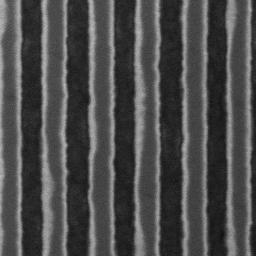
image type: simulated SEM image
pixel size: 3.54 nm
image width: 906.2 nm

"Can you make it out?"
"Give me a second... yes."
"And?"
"lines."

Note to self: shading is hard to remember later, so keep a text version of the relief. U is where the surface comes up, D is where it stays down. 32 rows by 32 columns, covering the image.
UUUDDUUUDDDUUUDDDUUUDDDUUUDDDUUD
UUUDDUUUDDDUUUDDDUUUDDDUUUDDUUUD
UUUDDUUUDDDUUUDDDUUUDDDUUUDDUUUD
UUUDDUUUDDDUUUDDDUUUDDDUUUDDUUUD
UUUDDUUUDDDUUUDDDUUUDDDUUUDDUUUD
UUUDDUUUDDDUUUDDDUUUDDDUUUDDUUUD
UUUDDUUUDDDUUUDDDUUUDDDUUUDDUUUD
UUUDDUUUDDDUUUDDDUUUDDDUUUDDUUUD
UUUDDUUUDDDUUUDDDUUUDDDUUUDDUUUD
UUUDDUUUDDDUUUDDDUUUDDDUUUDDUUUD
UUUDDUUUDDDUUUDDDUUUDDDUUUDDUUUD
UUUDDUUUDDDUUUDDDUUUDDDUUUDDUUUD
UUUDDUUUDDDUUUDDDUUUDDDUUUDDUUUD
UUUDDUUUDDDUUUDDDUUUDDDUUUDDUUUD
UUUDDUUUDDDUUUDDDUUUDDDUUUDDUUUD
UUUDDUUUDDDUUUDDDUUUDDDUUUDDUUUD
UUUDDUUUDDDUUUDDDUUUDDDUUUDDUUUD
UUUDDUUUDDDUUUDDDUUUDDDUUUDDUUUD
UUUDDUUUDDDUUUDDDUUUDDDUUUDDUUUD
UUUDDUUUDDDUUUDDDUUUDDDUUUDDUUUD
UUUDDUUUDDDUUUDDDUUUDDDUUUDDUUUD
UUUDDUUUDDDUUUDDDUUUDDDUUUDDUUUD
UUUDDUUUDDDUUUDDDUUUDDDUUUDDUUUD
UUUDDDUUDDDUUUDDDUUUDDDUUUDDUUUD
UUUDDUUUDDDUUUDDDUUUDDDUUUDDUUUD
UUUDDDUUDDDUUUDDDUUUDDDUUUDDUUUD
UUUDDDUUDDDUUUDDDUUUDDDUUUDDUUUD
UUUDDDUUDDDUUUDDDUUUDDDUUUDDUUUD
UUUDDDUUDDDUUUDDDUUUDDDUUUDDDUUD
UUUDDUUUDDDUUUDDDUUUDDDUUUDDDUUD
UUUDDDUUDDDUUUDDDUUUDDDUUUDDDUUD
UUUDDUUUDDDUUUDDDUUUDDDUUUDDDUUD